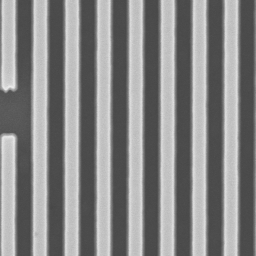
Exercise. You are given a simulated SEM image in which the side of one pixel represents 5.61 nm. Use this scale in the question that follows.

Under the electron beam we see parallel lines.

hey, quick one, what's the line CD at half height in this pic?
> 84.8 nanometers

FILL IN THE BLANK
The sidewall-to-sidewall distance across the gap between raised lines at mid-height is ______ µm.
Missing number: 0.094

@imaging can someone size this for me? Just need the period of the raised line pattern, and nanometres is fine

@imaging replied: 179